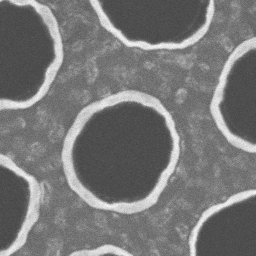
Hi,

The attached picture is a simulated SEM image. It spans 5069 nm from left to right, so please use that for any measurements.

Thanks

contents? raised bodies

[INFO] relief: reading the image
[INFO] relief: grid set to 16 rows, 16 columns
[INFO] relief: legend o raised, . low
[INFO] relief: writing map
ooo...ooooooo...
ooo....oooooo...
oooo....oooo....
oooo...........o
ooo...........oo
ooo...........oo
oo....oooo...ooo
.....oooooo...oo
....ooooooo...oo
....ooooooo.....
o...ooooooo.....
oo...ooooo......
oo....ooo......o
oo...........ooo
oo..........oooo
o...........oooo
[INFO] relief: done